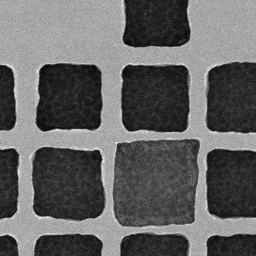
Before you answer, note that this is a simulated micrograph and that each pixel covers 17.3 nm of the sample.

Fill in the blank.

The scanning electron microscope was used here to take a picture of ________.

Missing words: holes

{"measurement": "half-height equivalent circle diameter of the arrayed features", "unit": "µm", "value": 1.33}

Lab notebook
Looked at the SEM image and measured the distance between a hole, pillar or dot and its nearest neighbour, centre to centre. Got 1480 nm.